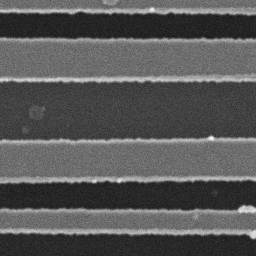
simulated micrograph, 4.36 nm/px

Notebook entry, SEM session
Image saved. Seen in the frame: lines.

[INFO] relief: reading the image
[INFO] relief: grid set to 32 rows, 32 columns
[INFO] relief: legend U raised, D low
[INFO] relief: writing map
UUUUUUUUUUUUUUUUUUUUUUUUUUUUUUUU
UUUUUUUUUUDUUUUUUUUUUUUUUUUUUUUU
DDDDDDDDDDDDDDDDDDDDDDDDDDDDDDDD
DDDDDDDDDDDDDDDDDDDDDDDDDDDDDDDD
DDDDDDDDDDDDDDDDDDDDDDDDDDDDDDDD
UUUUUUUUUUUUUUUUUUUUUUUUUUUUUUUU
UUUUUUUUUUUUUUUUUUUUUUUUUUUUUUUU
UUUUUUUUUUUUUUUUUUUUUUUUUUUUUUUU
UUUUUUUUUUUUUUUUUUUUUUUUUUUUUUUU
UUUUUUUUUUUUUUUUUUUUUUUUUUUUUUUU
DDDDDDDDDDDDDDDDDDDDDDDDDDDDDDDD
DDDDDDDDDDDDDDDDDDDDDDDDDDDDDDDD
DDDDDDDDDDDDDDDDDDDDDDDDDDDDDDDD
DDDDDDDDDDDDDDDDDDDDDDDDDDDDDDDD
DDDDDDDDDDDDDDDDDDDDDDDDDDDDDDDD
DDDDDDDDDDDDDDDDDDDDDDDDDDDDDDDD
DDDDDDDDDDDDDDDDDDDDDDDDDDDDDDDD
DDDDDDDUDDDDDDUDUUDDDUUUUUUUUUUU
UUUUUUUUUUUUUUUUUUUUUUUUUUUUUUUU
UUUUUUUUUUUUUUUUUUUUUUUUUUUUUUUU
UUUUUUUUUUUUUUUUUUUUUUUUUUUUUUUU
UUUUUUUUUUUUUUUUUUUUUUUUUUUUUUUU
UUUUUUUUUUUUUUUUUUUUUDUUUUDDUDDU
DDDDDDDDDDDDDDDDDDDDDDDDDDDDDDDD
DDDDDDDDDDDDDDDDDDDDDDDDDDDDDDDD
DDDDDDDDDDDDDDDDDDDDDDDDDDDDDDDD
UUUUUUUUUUUUUUUUUUUUUUUUUUUUUUUU
UUUUUUUUUUUUUUUUUUUUUUUUUUUUUUUU
UUUUUUUUUUUUUUUUUUUUUUUUUUUUUUUU
DDDDDDDDDDDDDDDDDDDDDDDDDDDDDDDU
DDDDDDDDDDDDDDDDDDDDDDDDDDDDDDDD
DDDDDDDDDDDDDDDDDDDDDDDDDDDDDDDD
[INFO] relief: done